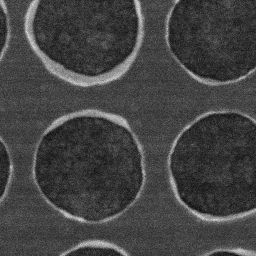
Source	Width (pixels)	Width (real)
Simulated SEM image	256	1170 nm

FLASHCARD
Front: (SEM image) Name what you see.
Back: holes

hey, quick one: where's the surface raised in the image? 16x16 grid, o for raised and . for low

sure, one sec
oo......ooo.....
oo.......oo.....
oo.......oo.....
ooo.....ooo.....
oooo...ooooo....
oooooooooooooooo
oooooooooooooooo
oooo...ooooo....
ooo.....ooo.....
oo.......oo.....
.o.......oo.....
oo.......oo.....
ooo.....ooo.....
ooooo..oooooo..o
oooooooooooooooo
ooooo..ooooooooo